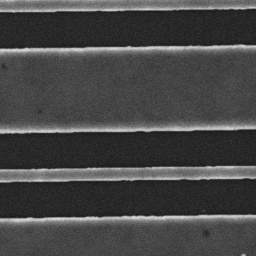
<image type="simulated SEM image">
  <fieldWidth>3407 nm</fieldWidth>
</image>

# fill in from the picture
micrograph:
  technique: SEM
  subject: lines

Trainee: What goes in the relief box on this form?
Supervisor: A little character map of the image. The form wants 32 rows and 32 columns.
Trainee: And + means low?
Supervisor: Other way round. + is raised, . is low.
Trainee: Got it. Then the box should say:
++++++++++++++++++++++++++++++++
................................
................................
................................
................................
................................
++++++++++++++++++++++++++++++++
++++++++++++++++++++++++++++++++
++++++++++++++++++++++++++++++++
++++++++++++++++++++++++++++++++
++++++++++++++++++++++++++++++++
++++++++++++++++++++++++++++++++
++++++++++++++++++++++++++++++++
++++++++++++++++++++++++++++++++
++++++++++++++++++++++++++++++++
++++++++++++++++++++++++++++++++
+++++++++.......................
................................
................................
................................
................................
++++++++++++++++++++++++++++++++
+++++++++++++++.+...............
................................
................................
................................
................................
++++++++++++++++++++++++++++++++
++++++++++++++++++++++++++++++++
++++++++++++++++++++++++++++++++
++++++++++++++++++++++++++++++++
++++++++++++++++++++++++++++++++